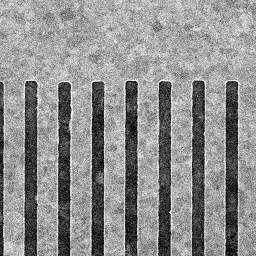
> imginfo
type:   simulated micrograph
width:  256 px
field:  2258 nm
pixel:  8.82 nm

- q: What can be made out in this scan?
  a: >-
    parallel lines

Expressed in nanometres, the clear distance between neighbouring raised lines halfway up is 114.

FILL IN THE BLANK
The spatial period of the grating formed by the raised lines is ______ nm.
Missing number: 295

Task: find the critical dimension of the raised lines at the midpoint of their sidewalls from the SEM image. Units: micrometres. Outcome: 0.183